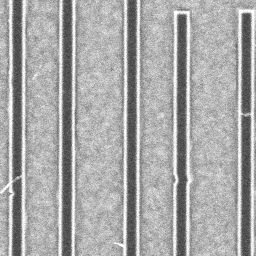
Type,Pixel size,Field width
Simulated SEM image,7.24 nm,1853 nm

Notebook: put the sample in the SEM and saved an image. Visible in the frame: parallel lines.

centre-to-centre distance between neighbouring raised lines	57.3	px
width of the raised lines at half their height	96.9	nm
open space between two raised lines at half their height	319	nm